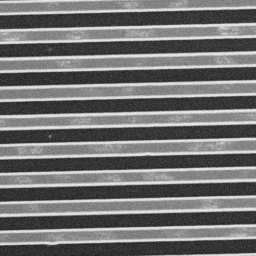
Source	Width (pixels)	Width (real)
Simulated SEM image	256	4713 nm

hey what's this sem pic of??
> parallel lines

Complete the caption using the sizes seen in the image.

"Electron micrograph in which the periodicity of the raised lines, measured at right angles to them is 529 nm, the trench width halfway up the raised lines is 292 nm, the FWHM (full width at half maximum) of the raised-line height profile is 239 nm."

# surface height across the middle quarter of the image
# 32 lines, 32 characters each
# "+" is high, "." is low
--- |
++++++++++++++++++++++++++++++++
+...............................
................................
................................
................................
.........+++++++++++++++++++++++
++++++++++++++++++++++++++++++++
++++++++++++++++++++++++++++++++
++++++++++......................
................................
................................
................................
..................++++++++++++++
++++++++++++++++++++++++++++++++
++++++++++++++++++++++++++++++++
++++++++++......................
................................
................................
................................
..........................++++++
++++++++++++++++++++++++++++++++
++++++++++++++++++++++++++++++++
++++++++++++++++++..............
................................
................................
................................
..........................+...++
++++++++++++++++++++++++++++++++
++++++++++++++++++++++++++++++++
+++++++++++++++++++++++++++.....
................................
................................